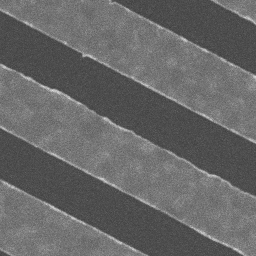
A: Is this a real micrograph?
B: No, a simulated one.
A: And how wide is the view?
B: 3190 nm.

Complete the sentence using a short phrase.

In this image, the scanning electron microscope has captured one or a few lines or trenches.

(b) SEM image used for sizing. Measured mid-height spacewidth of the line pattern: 581 nanometers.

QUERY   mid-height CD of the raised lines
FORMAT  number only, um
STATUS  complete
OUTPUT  0.721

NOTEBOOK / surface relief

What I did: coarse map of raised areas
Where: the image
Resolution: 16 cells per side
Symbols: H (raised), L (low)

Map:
HHHHHHHHLLLLLLHH
LLHHHHHHHHLLLLLL
LLLLHHHHHHHHLLLL
LLLLLHHHHHHHHHLL
HLLLLLLHHHHHHHHL
HHHLLLLLLHHHHHHH
HHHHHLLLLLLHHHHH
HHHHHHHLLLLLLHHH
LHHHHHHHHLLLLLLH
LLLHHHHHHHHLLLLL
LLLLLHHHHHHHLLLL
HLLLLLLHHHHHHHLL
HHLLLLLLLHHHHHHH
HHHHLLLLLLLHHHHH
HHHHHHLLLLLLHHHH
HHHHHHHHLLLLLLHH